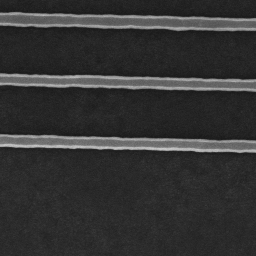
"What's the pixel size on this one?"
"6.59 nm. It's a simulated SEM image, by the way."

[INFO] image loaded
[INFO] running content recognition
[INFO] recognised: parallel lines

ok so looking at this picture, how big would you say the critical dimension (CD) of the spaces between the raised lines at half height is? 334 nm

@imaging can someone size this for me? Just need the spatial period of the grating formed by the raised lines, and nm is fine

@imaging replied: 401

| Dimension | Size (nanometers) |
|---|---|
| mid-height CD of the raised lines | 65.1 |